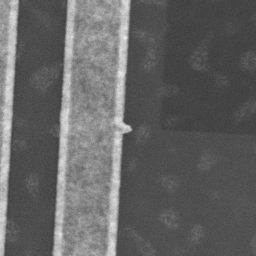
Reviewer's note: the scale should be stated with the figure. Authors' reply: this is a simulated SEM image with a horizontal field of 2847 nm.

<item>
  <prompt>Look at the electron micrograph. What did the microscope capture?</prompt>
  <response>one or a few lines or trenches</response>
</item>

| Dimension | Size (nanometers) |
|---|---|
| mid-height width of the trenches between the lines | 648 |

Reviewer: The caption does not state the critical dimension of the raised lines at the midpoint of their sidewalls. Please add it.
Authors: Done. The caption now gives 583 nm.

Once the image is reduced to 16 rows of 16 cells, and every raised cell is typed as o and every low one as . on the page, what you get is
o....ooo........
o...oooo........
o...oooo........
o...oooo........
o...oooo........
o...ooo.........
....ooo.........
....ooo.........
....ooo.........
....ooo.........
....ooo.........
....ooo.........
....ooo.........
....ooo.........
....ooo.........
....ooo.........